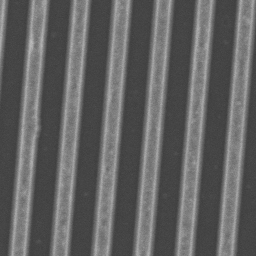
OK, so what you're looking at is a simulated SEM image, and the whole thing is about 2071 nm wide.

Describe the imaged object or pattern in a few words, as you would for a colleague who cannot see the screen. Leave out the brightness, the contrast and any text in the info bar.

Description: parallel lines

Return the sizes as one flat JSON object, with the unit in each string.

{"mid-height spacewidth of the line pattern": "25.6 pixels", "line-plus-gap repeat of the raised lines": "0.334 microns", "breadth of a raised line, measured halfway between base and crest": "15.9 px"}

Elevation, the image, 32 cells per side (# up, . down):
#...##...##...##...##....##...##
#...##...##...##...##....##...##
#...##...##...##...##....#....##
....##...##...##...##...##....##
....##...##...##...##...##...###
....#....##...##...##...##....#.
...##....##...##...##...##...##.
...##....##...##...##...##...##.
...##...##....##...##...##...##.
...##...##....#....##...##...##.
...##...##...##....##...##...##.
...##...##...##....##...##...##.
...##...##...##...##....##...##.
...##...##...##...##....##...##.
...##...##...##...##....#....##.
...##...##...##...##...##....##.
...##...##...##...##...##....##.
...#....##...##...##...##...##..
..##....##...##...##...##...##..
..##....##...##...##...##...##..
..##...##....##...##...##...##..
..##...##....#....##...##...##..
..##...##...##....##...##...##..
..##...##...##....##...##...##..
..##...##...##...##....##...##..
..##...##...##...##....##...##..
..##...##...##...##....#....##..
..##...##...##...##...##....##..
..##...##...##...##...##...###..
..#....##...##...##...##...##...
.##....##...##...##...##...##...
.##....##...##...##...##...##...